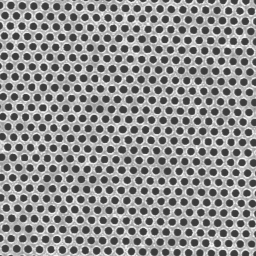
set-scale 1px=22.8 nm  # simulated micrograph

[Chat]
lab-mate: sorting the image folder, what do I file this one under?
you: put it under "a regular array of holes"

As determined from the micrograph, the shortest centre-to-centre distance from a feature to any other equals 0.258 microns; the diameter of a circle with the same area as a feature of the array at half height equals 180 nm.